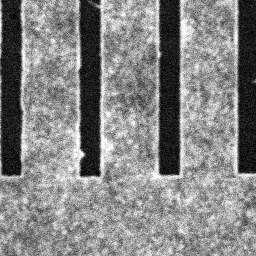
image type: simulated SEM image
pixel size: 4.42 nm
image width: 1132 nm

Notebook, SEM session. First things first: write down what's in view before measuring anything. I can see one or a few lines or trenches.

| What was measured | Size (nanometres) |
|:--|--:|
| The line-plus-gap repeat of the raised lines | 351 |